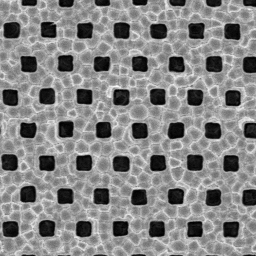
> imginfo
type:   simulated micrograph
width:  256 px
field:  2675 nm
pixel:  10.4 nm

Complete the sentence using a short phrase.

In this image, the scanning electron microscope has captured a regular array of holes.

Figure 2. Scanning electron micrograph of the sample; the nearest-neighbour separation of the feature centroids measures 381 nm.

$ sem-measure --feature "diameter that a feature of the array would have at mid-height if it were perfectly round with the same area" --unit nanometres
181